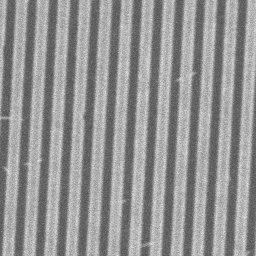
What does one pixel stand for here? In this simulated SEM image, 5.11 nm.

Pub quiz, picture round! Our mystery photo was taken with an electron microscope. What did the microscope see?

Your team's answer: parallel lines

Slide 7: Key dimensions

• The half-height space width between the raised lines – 56.1 nm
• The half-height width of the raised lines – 0.0516 microns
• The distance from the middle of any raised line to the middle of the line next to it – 107 nanometres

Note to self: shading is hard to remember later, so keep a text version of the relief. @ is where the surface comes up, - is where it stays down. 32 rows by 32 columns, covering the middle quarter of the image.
---@@@---@@---@@---@@---@@@---@@
---@@@--@@@---@@---@@---@@@---@@
---@@---@@@---@@---@@---@@---@@@
---@@---@@@---@@---@@---@@---@@@
---@@---@@@---@@---@@---@@---@@@
---@@---@@@---@@---@@---@@---@@@
---@@---@@@--@@@---@@---@@---@@@
---@@---@@@--@@@---@@---@@---@@@
---@@---@@---@@@---@@---@@---@@-
---@@---@@---@@---@@@---@@---@@-
---@@---@@---@@---@@@---@@---@@-
---@@---@@---@@---@@@---@@---@@-
---@@---@@---@@---@@@---@@---@@-
---@@---@@---@@---@@@---@@---@@-
--@@@---@@---@@---@@@--@@@---@@-
--@@@---@@---@@---@@---@@@---@@-
--@@@---@@---@@---@@---@@@---@@-
--@@@---@@---@@---@@---@@@---@@-
--@@@---@@---@@---@@---@@@---@@-
--@@@---@@---@@---@@---@@@---@@-
--@@@--@@@---@@---@@---@@@--@@@-
--@@---@@@---@@---@@---@@---@@@-
--@@---@@@---@@---@@---@@---@@@-
--@@---@@@---@@---@@---@@---@@@-
--@@---@@@--@@@---@@---@@---@@@-
--@@---@@@--@@@---@@---@@---@@@-
--@@---@@---@@@---@@---@@---@@--
--@@---@@---@@@--@@@---@@---@@--
--@@---@@---@@---@@@---@@---@@--
--@@---@@---@@---@@@---@@---@@--
--@@---@@---@@---@@@---@@---@@--
--@@---@@---@@---@@@---@@---@@--